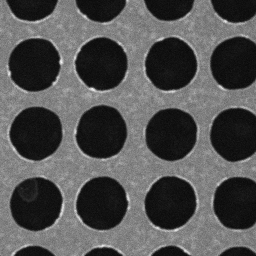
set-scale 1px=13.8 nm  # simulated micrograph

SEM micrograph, a regular array of holes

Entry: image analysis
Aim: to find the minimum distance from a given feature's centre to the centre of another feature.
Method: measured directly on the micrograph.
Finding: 0.924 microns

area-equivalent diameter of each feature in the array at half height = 736 nanometers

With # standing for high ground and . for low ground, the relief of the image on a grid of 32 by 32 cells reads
#......###......##......##......
#......###.....####.....###.....
###..######...######..######...#
################################
################################
##.....####....####....####.....
#......###......##......###.....
#.......#.......##.......#......
#.......#.......##.......#......
#......###......##......###.....
##.....####....####.....###.....
################################
################################
###...#####...###############.##
##.....###.....####.....###.....
#.......##......##.......#......
#.......#.......##.......#......
#.......#.......##.......#......
##.....###.....####.....###.....
###...#####...######...#####...#
################################
################################
###...#####....#####...#####....
##.....###.....####.....###.....
#.......##......##.......##.....
#.......##......##.......##.....
#.......##......##......###.....
##.....###.....####.....###.....
###...#####...######..######...#
################################
################################
##....#####....####....#####....